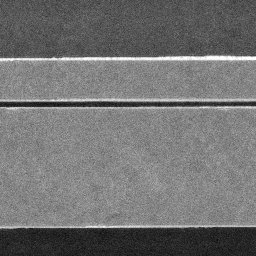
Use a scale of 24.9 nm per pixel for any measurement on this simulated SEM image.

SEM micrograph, lines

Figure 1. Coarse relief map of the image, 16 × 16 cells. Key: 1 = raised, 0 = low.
0000000000000000
0000000000000000
0000000000000000
0000000000000000
1111111111111111
1111111111111111
1111111111111111
1111111111111111
1111111111111111
1111111111111111
1111111111111111
1111111111111111
1111111111111111
1111111111111111
0000000000000000
0000000000000000